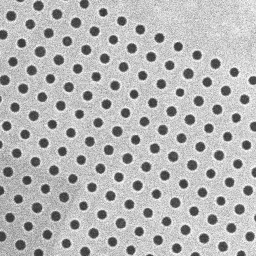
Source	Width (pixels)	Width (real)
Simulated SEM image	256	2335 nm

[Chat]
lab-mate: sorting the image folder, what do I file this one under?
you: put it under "a regular array of holes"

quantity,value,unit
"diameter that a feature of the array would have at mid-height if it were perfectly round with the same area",90.3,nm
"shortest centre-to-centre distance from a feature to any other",185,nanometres